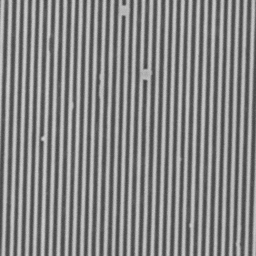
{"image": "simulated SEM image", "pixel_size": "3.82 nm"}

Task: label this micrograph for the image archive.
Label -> parallel lines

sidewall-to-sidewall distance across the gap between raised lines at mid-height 0.0167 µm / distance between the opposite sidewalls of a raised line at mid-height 0.0134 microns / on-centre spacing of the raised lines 0.0299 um